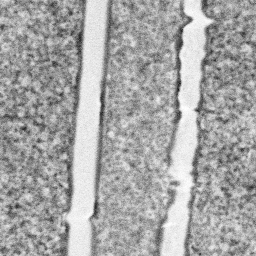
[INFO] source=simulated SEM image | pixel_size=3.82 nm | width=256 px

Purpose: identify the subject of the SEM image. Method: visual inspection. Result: one or a few lines or trenches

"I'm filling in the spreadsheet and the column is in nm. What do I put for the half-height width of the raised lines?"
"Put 386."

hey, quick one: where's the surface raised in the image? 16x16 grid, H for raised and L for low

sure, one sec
LLLLLLHHHHHHLLLL
LLLLLLHHHHHHLLLL
LLLLLLHHHHHHLLLL
LLLLLLHHHHHHLLLL
LLLLLLHHHHHHLLLL
LLLLLLHHHHHHLLLL
LLLLLLHHHHHHLLLL
LLLLLHHHHHHHLLLL
LLLLLHHHHHHHLLLL
LLLLLHHHHHHHLLLL
LLLLLHHHHHHLLLLL
LLLLLHHHHHHHLLLL
LLLLLHHHHHHHLLLL
LLLLLHHHHHHLLLLL
LLLLLHHHHHHLLLLL
LLLLLHHHHHHLLLLL